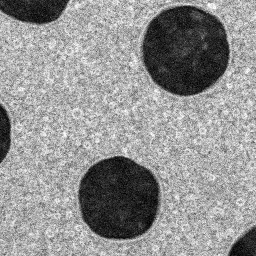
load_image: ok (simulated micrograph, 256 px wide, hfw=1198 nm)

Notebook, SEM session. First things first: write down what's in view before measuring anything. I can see holes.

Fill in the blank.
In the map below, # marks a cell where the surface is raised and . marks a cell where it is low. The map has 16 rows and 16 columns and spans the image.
....######...###
##.######.....##
#########.....##
#########.....##
#########.....##
##########...###
################
.###############
.###############
.###############
######...#######
#####.....######
#####.....######
#####.....######
######...######.
##############..